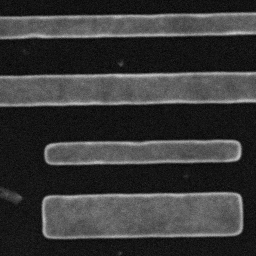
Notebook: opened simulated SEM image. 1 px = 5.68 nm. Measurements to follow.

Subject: groups of lines, slits or small figures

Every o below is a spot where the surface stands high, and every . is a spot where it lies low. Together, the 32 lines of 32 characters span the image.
................................
................................
oooooooooooooooooooooooooooooooo
oooooooooooooooooooooooooooooooo
oooooooooooooooooooo............
................................
................................
................................
................................
...ooooooooooooooooooooooooooooo
oooooooooooooooooooooooooooooooo
oooooooooooooooooooooooooooooooo
oooooooooooooooooooooooooooooooo
................................
................................
................................
................................
................................
......oooooooooooooooooooooooo..
......oooooooooooooooooooooooo..
......oooooo....................
................................
................................
................................
......oo.ooooooooooooooooooooo..
.....ooooooooooooooooooooooooo..
.....ooooooooooooooooooooooooo..
.....ooooooooooooooooooooooooo..
.....ooooooooooooooooooooooooo..
......ooooooooooooooooooooooo...
................................
................................